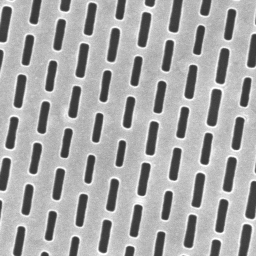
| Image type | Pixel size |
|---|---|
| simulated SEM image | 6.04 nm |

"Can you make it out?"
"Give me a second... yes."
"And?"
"a regular array of holes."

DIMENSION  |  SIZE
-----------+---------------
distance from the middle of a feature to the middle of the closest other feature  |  208 nanometres